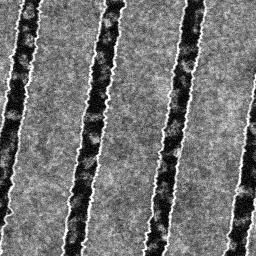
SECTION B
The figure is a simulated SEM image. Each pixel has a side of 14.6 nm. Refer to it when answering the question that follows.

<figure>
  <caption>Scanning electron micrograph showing one or a few lines or trenches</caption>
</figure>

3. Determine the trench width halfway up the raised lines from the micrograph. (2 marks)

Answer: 880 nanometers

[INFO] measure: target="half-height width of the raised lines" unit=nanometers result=305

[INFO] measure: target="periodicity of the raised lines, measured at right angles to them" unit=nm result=1180